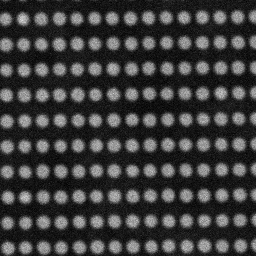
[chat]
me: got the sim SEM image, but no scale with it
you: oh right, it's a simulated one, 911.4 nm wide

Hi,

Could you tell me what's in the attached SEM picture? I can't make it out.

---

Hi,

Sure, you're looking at a regular array of raised bodies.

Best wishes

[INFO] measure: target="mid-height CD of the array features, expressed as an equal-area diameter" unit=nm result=44.9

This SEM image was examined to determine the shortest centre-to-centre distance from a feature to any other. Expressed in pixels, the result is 17.6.